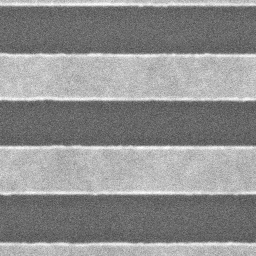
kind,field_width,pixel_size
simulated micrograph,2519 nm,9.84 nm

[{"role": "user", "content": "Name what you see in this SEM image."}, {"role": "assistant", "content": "lines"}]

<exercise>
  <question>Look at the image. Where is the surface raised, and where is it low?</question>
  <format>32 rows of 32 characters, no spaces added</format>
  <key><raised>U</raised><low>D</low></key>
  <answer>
UUUUUUUUUUUUUUUUUUUUUUUUUUUUUUUU
DDDDDDDDDDDDDDDDDDDDDDDDDDDDDDDD
DDDDDDDDDDDDDDDDDDDDDDDDDDDDDDDD
DDDDDDDDDDDDDDDDDDDDDDDDDDDDDDDD
DDDDDDDDDDDDDDDDDDDDDDDDDDDDDDDD
DDDDDDDDDDDDDDDDDDDDDDDDDDDDDDDD
DDDDDDDDDDDDDDDDDDDDDDDDDDDDDDDD
UUUUUUUUUUUUUUUUUUUUUUUUUUUUUUUU
UUUUUUUUUUUUUUUUUUUUUUUUUUUUUUUU
UUUUUUUUUUUUUUUUUUUUUUUUUUUUUUUU
UUUUUUUUUUUUUUUUUUUUUUUUUUUUUUUU
UUUUUUUUUUUUUUUUUUUUUUUUUUUUUUUU
DDDDDDDDDDDDDDDDDDDDDUDDDUUDDUUD
DDDDDDDDDDDDDDDDDDDDDDDDDDDDDDDD
DDDDDDDDDDDDDDDDDDDDDDDDDDDDDDDD
DDDDDDDDDDDDDDDDDDDDDDDDDDDDDDDD
DDDDDDDDDDDDDDDDDDDDDDDDDDDDDDDD
DDDDDDDDDDDDDDDDDDDDDDDDDDDDDDDD
UUUUUUUUUUUUUUUUUUUUUUUUUUUUUUUU
UUUUUUUUUUUUUUUUUUUUUUUUUUUUUUUU
UUUUUUUUUUUUUUUUUUUUUUUUUUUUUUUU
UUUUUUUUUUUUUUUUUUUUUUUUUUUUUUUU
UUUUUUUUUUUUUUUUUUUUUUUUUUUUUUUU
UUUUUUUUUUUUUUUUUUUUUUUUUUUUUUUU
DDDDDDDDDDDDDDDDDDDDDDDDDDDDDDDD
DDDDDDDDDDDDDDDDDDDDDDDDDDDDDDDD
DDDDDDDDDDDDDDDDDDDDDDDDDDDDDDDD
DDDDDDDDDDDDDDDDDDDDDDDDDDDDDDDD
DDDDDDDDDDDDDDDDDDDDDDDDDDDDDDDD
DDDDDDDDDDDDDDDDDDDDDDDDDDDDDDDD
UUUUUUUUUDDUUUUUUUUUUUUUUUUUUUUU
UUUUUUUUUUUUUUUUUUUUUUUUUUUUUUUU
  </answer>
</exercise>